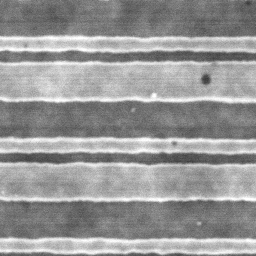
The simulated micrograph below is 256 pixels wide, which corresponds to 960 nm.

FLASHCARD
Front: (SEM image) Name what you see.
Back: lines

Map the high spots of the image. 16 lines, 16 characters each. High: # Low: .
................
................
################
################
################
################
................
................
................
################
################
################
.........##.....
................
................
################